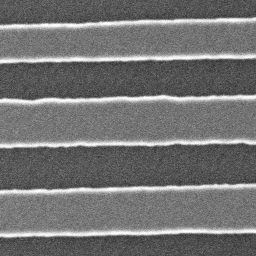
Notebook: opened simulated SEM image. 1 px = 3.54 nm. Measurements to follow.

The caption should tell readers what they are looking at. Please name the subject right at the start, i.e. lines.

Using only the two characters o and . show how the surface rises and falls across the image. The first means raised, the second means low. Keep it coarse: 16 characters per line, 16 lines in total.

................
.....ooooooooooo
oooooooooooooooo
oooooooooooooooo
................
................
oooooooooooooooo
oooooooooooooooo
oooooooooooooooo
................
................
................
oooooooooooooooo
oooooooooooooooo
oooooooooooooooo
................